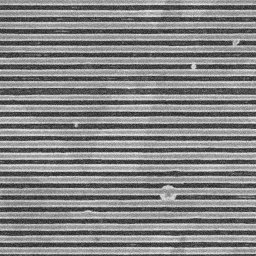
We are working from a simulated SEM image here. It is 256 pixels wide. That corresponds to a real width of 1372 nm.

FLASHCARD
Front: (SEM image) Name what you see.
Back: parallel lines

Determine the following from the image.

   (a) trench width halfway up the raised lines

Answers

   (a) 0.0315 micrometres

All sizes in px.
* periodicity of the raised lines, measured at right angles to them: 11.8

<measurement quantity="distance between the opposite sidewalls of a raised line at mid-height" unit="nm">31.5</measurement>